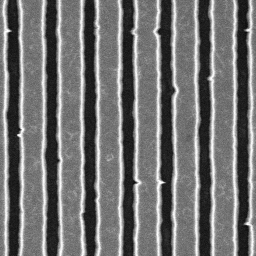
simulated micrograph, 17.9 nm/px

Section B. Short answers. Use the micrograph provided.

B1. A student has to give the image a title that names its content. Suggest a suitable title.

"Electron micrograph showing parallel lines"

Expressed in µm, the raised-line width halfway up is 0.44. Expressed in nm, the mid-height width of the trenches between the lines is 234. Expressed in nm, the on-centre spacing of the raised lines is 682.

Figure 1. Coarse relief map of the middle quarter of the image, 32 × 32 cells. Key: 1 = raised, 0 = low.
11111000111111000011111100011111
11111000111111000011111100011111
11111000111111000011111100011111
11111000111111000011111100011111
11111000111111000011111100011111
11111000111111000011111100011111
11111000111111000011111100001111
11111000111111000011111100001111
11111000111111000011111100011111
11111000111111000011111100011111
11111000111111000011111100011111
11111000111111000011111100011111
11111000111111000011111100011111
11111000111111000011111100011111
11111000111111000011111100011111
11111000111111000011111100011111
11111000111111000011111100011111
11111000111111000011111100011111
11111000111111000011111100011111
11111000111111000011111100011111
11111000111111000011111100001111
11111000111111000011111100001111
11111000111111000011111100001111
11111000111111000011111100001111
11111000111111000011111100001111
11111000111111000011111100001111
11111000111111000011111100001111
11111000111111100011111100001111
11111000111111100011111100011111
11111000111111100011111110011111
11111000111111100011111100011111
11111000111111100011111100011111